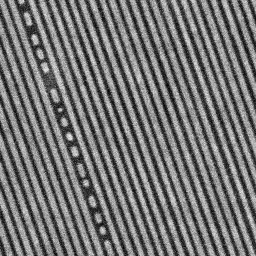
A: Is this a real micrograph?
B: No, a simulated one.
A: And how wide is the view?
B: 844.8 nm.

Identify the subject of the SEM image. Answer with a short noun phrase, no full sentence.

parallel lines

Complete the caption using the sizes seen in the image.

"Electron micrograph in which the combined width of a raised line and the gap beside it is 31.4 nanometres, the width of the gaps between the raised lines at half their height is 15.1 nanometers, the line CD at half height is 0.0148 um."